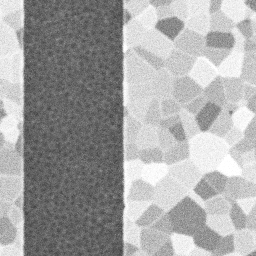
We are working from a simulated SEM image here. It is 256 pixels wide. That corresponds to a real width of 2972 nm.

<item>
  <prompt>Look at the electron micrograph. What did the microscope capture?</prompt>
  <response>one or a few lines or trenches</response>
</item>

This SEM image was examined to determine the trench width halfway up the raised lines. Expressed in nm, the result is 1190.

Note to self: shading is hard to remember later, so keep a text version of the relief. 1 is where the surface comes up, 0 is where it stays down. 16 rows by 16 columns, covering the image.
1000000011111111
1000000011111111
1000000011111111
1000000011111111
1000000011111111
1000000011111111
1000000011111111
1000000011111111
1000000011111111
1000000011111111
1000000011111111
1000000011111111
1000000011111111
1000000011111111
1000000011111111
1000000011111111